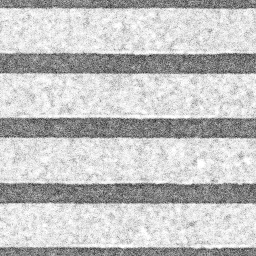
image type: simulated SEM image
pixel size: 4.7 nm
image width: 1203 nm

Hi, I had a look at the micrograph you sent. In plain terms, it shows one or a few lines or trenches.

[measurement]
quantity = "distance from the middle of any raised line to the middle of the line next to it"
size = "304 nm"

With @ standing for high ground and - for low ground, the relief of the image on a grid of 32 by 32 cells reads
--------------------------------
@@@@@@@@@@@@@@@@@@@@@@@@@@@@@@@@
@@@@@@@@@@@@@@@@@@@@@@@@@@@@@@@@
@@@@@@@@@@@@@@@@@@@@@@@@@@@@@@@@
@@@@@@@@@@@@@@@@@@@@@@@@@@@@@@@@
@@@@@@@@@@@@@@@@@@@@@@@@@@@@@@@@
@@@@@@@@@@@@@@@@@@@@@@@@@@@@@@@@
--------------------------------
--------------------------------
@@@@@@@@@@@@@@@@@@@@@@@@@@@@@@@@
@@@@@@@@@@@@@@@@@@@@@@@@@@@@@@@@
@@@@@@@@@@@@@@@@@@@@@@@@@@@@@@@@
@@@@@@@@@@@@@@@@@@@@@@@@@@@@@@@@
@@@@@@@@@@@@@@@@@@@@@@@@@@@@@@@@
@@@@@@@@@@@@@@@@@@@@@@@@@@@@@@@@
--------------------------------
--------------------------------
@@@@@@@@@@@@@@@@@@@@@@@@@@@@@@@@
@@@@@@@@@@@@@@@@@@@@@@@@@@@@@@@@
@@@@@@@@@@@@@@@@@@@@@@@@@@@@@@@@
@@@@@@@@@@@@@@@@@@@@@@@@@@@@@@@@
@@@@@@@@@@@@@@@@@@@@@@@@@@@@@@@@
@@@@@@@@@@@@@@@@@@@@@@@@@@@@@@@@
--------------------------------
--------------------------------
------------------@-----@@@--@@@
@@@@@@@@@@@@@@@@@@@@@@@@@@@@@@@@
@@@@@@@@@@@@@@@@@@@@@@@@@@@@@@@@
@@@@@@@@@@@@@@@@@@@@@@@@@@@@@@@@
@@@@@@@@@@@@@@@@@@@@@@@@@@@@@@@@
@@@@@@@@@@@@@@@@@@@@@@@@@@@@@@@@
--------------------------------